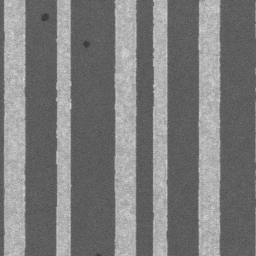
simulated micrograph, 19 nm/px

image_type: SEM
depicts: lines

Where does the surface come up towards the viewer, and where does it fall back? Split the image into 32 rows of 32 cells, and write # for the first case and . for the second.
.##....##......##..##....##.....
.##....##......##..##....##.....
.##....##......##..##....##.....
.##....##......##..##....##.....
.##....##......##..##....##.....
.##....##......##..##....##.....
.##....##......##..##....##.....
.##....##......##..##....##.....
.##....##......##..##....##.....
.##....##......##..##....##.....
.##....##......##..##....##.....
.##....##......##..##....##.....
.##....##......##..##....##.....
.##....##......##..##....##.....
.##....##......##..##....##.....
.##....##......##..##....##.....
.##....##......##..##....##.....
.##....##......##..##....##.....
.##....##......##..##....##.....
.##....##......##..##....##.....
.##....##......##..##....##.....
.##....##......##..##....##.....
.##....##......##..##....##.....
.##....##......##..##....##.....
.##....##......##..##....##.....
.##....##......##..##....##.....
.##....##......##..##....##.....
.##....##......##..##....##.....
.##....##......##..##....##.....
.##....##......##..##....##.....
.##....##......##..##....##.....
.##....##......##..##....##.....